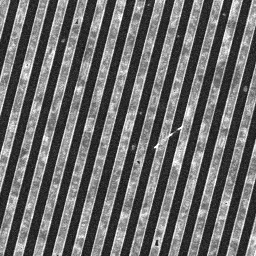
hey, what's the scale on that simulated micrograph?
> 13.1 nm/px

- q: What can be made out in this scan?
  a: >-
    parallel lines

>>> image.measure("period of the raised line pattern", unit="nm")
246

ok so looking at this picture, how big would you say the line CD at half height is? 111 nanometers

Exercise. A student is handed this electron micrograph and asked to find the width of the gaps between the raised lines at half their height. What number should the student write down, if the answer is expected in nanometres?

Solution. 132